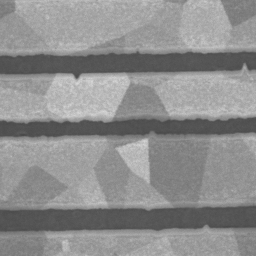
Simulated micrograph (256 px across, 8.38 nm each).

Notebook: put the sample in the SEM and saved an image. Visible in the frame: one or a few lines or trenches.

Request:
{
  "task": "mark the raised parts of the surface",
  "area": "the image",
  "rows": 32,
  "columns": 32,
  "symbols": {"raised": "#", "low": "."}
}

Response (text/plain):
################################
################################
################################
################################
################################
################################
#####...........................
................................
................................
.............###################
################################
################################
################################
################################
##################.###.#..##..#.
................................
................................
##.#.#.#########################
################################
################################
################################
################################
################################
################################
################################
########################..##....
................................
................................
................................
################################
################################
################################